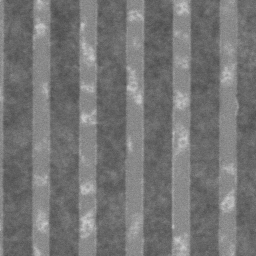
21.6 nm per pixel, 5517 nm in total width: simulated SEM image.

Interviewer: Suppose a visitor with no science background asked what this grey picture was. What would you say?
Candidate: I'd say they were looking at parallel lines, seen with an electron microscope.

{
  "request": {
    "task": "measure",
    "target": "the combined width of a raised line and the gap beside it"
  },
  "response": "1.01 microns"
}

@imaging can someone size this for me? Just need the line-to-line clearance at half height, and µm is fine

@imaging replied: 0.331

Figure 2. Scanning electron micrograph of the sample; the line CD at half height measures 31.3 pixels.